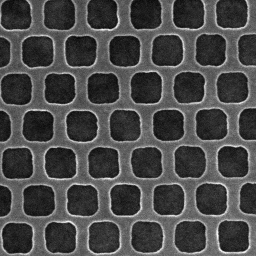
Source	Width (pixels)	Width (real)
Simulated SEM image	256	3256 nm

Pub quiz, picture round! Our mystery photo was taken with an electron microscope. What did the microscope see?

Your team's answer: a regular array of holes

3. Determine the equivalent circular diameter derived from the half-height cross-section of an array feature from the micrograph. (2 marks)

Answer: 0.431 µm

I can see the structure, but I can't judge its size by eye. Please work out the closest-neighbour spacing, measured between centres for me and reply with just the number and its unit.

0.544 µm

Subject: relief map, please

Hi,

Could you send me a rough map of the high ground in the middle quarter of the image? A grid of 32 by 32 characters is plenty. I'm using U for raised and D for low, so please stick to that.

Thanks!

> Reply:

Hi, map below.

UDDDDDDUUUUUUDDDDDUUUUUUDDDDUUUU
UUUUUUUUUUUUUUUUUUUUUUUUUUUUUUUU
DDUUUUUDDDDDDUUUUUDDDDDDUUUUDDDD
DDDUUUDDDDDDDUUUUDDDDDDDUUUUDDDD
DDDUUUDDDDDDDDUUUDDDDDDDDUUDDDDD
DDDUUUDDDDDDDDUUUDDDDDDDDUUDDDDD
DDDUUUDDDDDDDDUUUDDDDDDDDUUDDDDD
DDDUUUDDDDDDDDUUUDDDDDDDUUUDDDDD
DDDUUUDDDDDDDDUUUDDDDDDDUUUUDDDD
DDUUUUUDDDDDDUUUUUDDDDDDUUUUDDDD
UUUUUUUUUUUUUUUUUUUUUUUUUUUUUUUU
UUUUUUUUUUUUUDDDDUUUUUUUUDDDDUUU
UDDDDDDDUUUUDDDDDDDUUUUDDDDDDDUU
DDDDDDDDUUUDDDDDDDDUUUDDDDDDDDUU
DDDDDDDDUUUDDDDDDDDUUUDDDDDDDDUU
UDDDDDDDUUUDDDDDDDDUUUDDDDDDDDUU
UDDDDDDDUUUDDDDDDDDUUUDDDDDDDDUU
UDDDDDDDUUUUDDDDDDDUUUDDDDDDDDUU
UDDDDDDDUUUUDDDDDDDUUUUDDDDDDUUU
UUUDDUUUUUUUUUUUUUUUUUUUUUUUUUUU
UUUUUUUUUUUUUUUUUUUUUUUUUUUUUDDU
DDUUUUUDDDDDDUUUUUDDDDDDUUUUDDDD
DDDUUUDDDDDDDDUUUDDDDDDDUUUDDDDD
DDDUUUDDDDDDDDUUUDDDDDDDUUUUDDDD
DDDUUUDDDDDDDDUUUDDDDDDDUUUDDDDD
DDDUUUDDDDDDDDUUUDDDDDDDDUUUDDDD
DDDUUUDDDDDDDDUUUDDDDDDDDUUUDDDD
DDDUUUDDDDDDDDUUUDDDDDDDUUUUDDDD
DDUUUUUDDDDDDUUUUUUDDDDUUUUUUDUU
UUUUUUUUUUUUUUUUUUUUUUUUUUUUUUUU
UUDDDDDUUUUUDDDDDDUUUUUDDDDDDUUU
UDDDDDDDUUUUDDDDDDDUUUDDDDDDDDUU